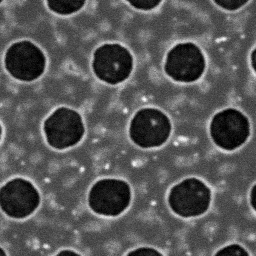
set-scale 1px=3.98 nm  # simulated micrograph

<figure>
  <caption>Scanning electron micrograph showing a regular array of holes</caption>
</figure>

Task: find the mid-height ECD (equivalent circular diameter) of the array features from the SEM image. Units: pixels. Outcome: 41.5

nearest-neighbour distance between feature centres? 310 nanometers